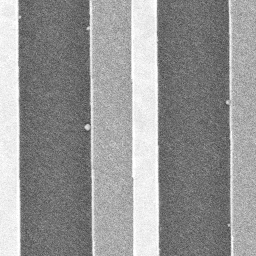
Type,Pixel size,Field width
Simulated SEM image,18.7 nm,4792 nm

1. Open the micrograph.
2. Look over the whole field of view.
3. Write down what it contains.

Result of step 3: lines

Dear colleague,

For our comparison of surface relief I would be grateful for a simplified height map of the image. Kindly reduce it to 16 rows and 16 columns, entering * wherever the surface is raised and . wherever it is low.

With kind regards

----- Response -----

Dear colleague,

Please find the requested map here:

*.....****....**
*.....****....**
*.....****....**
*.....****....**
*.....****....**
*.....****....**
*.....****....**
*.....****....**
*.....****....**
*.....****.....*
*.....****.....*
*.....****.....*
*.....****.....*
*.....****.....*
*.....****.....*
*.....****.....*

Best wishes